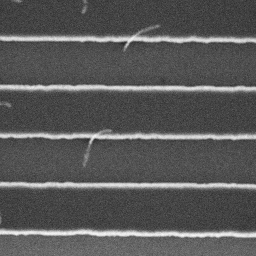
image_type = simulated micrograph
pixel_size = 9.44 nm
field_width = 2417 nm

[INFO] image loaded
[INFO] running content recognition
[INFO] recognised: lines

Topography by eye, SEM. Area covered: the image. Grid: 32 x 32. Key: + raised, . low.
++++++++++++++++++++++++++++++++
++++++++++++++++++++++++++++++++
++++++++++++++++++++++++++++++++
++++++++++++++++++++++++++++++++
++++++++++++++++++++++++++++++++
................................
................................
................................
................................
................................
................................
++++++++++++++++++++++++++++++++
++++++++++++++++++++++++++++++++
++++++++++++++++++++++++++++++++
++++++++++++++++++++++++++++++++
++++++++++++++++++++++++++++++++
++++++++++++++++++++++++++++++++
................................
................................
................................
................................
................................
................................
++++++++++++++++++++++++++++++++
++++++++++++++++++++++++++++++++
++++++++++++++++++++++++++++++++
++++++++++++++++++++++++++++++++
++++++++++++++++++++++++++++++++
++++++++++++++++++++++++++++++++
.............................+++
................................
................................